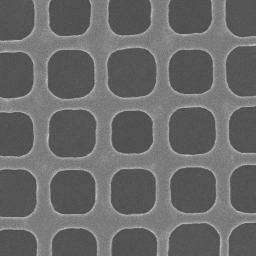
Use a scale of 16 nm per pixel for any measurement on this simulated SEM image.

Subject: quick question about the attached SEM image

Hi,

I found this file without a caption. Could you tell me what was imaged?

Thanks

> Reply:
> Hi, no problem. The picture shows a regular array of holes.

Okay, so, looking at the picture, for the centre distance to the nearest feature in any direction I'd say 0.944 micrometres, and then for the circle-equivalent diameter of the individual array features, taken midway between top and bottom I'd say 0.778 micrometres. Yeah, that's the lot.